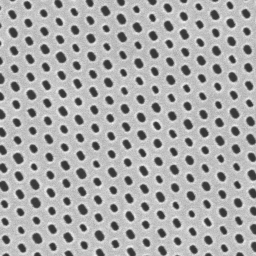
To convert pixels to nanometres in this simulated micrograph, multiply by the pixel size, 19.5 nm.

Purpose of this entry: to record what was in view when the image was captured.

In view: a regular array of holes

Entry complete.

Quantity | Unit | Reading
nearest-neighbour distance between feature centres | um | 0.346